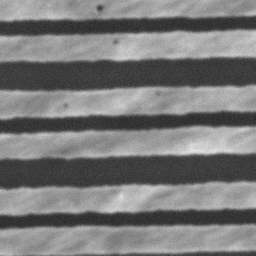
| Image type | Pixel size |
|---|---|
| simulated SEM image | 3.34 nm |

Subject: lines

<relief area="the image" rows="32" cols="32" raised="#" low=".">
################################
################################
##.......#......................
................................
..#..###########################
################################
################################
##########.#..#.................
................................
................................
................................
###..####..#####################
################################
################################
########........................
................................
...........#####################
################################
################################
##############..................
................................
................................
................................
......###..#####################
################################
################################
###########.##..#...............
................................
....############################
################################
################################
#######################.........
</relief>